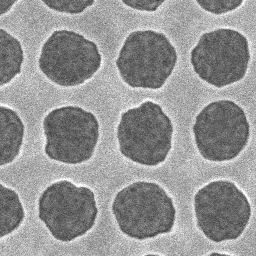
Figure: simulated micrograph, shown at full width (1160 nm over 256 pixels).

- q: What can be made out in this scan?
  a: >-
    a regular array of holes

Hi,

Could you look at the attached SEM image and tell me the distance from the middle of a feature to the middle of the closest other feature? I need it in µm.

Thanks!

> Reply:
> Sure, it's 0.339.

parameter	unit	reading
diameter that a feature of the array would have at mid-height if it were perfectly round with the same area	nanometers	263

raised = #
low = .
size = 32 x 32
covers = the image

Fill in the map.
..####.....#####....#####.....##
.#######..################..####
################################
################################
..####....######.....####.....##
..####......####.....####......#
...##.......###.......##.......#
...##........##.......##.......#
...##.......###.......##.......#
..####......###......####.....##
.######...######....######...###
################################
################################
.#######..#######...######....##
..####......###......####......#
...##.......###......###.......#
...###......###......###.......#
...###......###......###.......#
..####......###......####.....##
..####.....#####.....####....###
.#################..############
################################
################################
.#####.....#####....#####.....##
..###.......###......###.......#
...##.......##........##.......#
...##.......##........##.......#
...##.......###.......###......#
..####.....####.......###......#
#######...######...#######....##
################################
################################